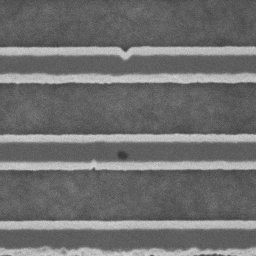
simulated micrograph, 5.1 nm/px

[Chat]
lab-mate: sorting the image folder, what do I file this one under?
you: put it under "one or a few lines or trenches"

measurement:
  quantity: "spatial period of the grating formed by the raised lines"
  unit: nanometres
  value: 444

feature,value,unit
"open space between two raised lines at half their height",0.294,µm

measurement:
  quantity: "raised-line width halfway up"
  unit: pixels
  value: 29.2